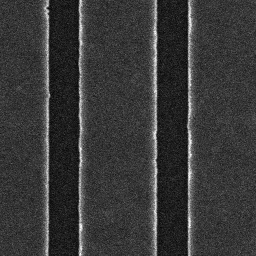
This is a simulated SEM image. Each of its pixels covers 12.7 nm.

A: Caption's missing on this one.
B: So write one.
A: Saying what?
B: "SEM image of one or a few lines or trenches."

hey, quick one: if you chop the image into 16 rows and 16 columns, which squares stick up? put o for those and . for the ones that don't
ooo..ooooo..oooo
ooo..ooooo..oooo
ooo..ooooo..oooo
ooo..ooooo..oooo
ooo..ooooo..oooo
ooo..ooooo..oooo
ooo..ooooo..oooo
ooo..ooooo..oooo
ooo..ooooo..oooo
ooo..ooooo..oooo
ooo..ooooo..oooo
ooo..ooooo..oooo
ooo..ooooo..oooo
ooo..ooooo..oooo
ooo..ooooo..oooo
ooo..ooooo..oooo